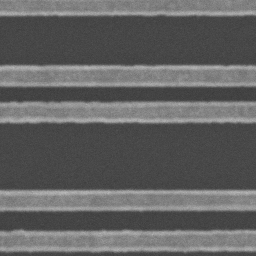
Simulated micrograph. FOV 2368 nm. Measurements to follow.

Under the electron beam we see lines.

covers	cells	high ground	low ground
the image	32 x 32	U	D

UUUUUUUUUUUUUUUUUUUUUUUUUUUUUUUU
UUUUUUUUUUUUUUUUUUUUUUUUUUUUUUUU
DDDDDDDDDDDDDDDDDDDDDDDDDDDDDDDD
DDDDDDDDDDDDDDDDDDDDDDDDDDDDDDDD
DDDDDDDDDDDDDDDDDDDDDDDDDDDDDDDD
DDDDDDDDDDDDDDDDDDDDDDDDDDDDDDDD
DDDDDDDDDDDDDDDDDDDDDDDDDDDDDDDD
DDDDDDDDDDDDDDDDDDDDDDDDDDDDDDDD
UUUUUDUUUUUUUUUUUUUUUUUUUUUUUUUU
UUUUUUUUUUUUUUUUUUUUUUUUUUUUUUUU
UUUUUUUUUUUUUUUUUUUUUUUUUUUUUUUU
DDDDDDDDDDDDDDDDDDDDDDDDDDDDDDDD
DDDDDDDDDDDDDDDDDDDDDDDDDDDDDDDD
UUUUUUUUUUUUUUUUUUUUUUUUUUUUUUUU
UUUUUUUUUUUUUUUUUUUUUUUUUUUUUUUU
DDDDDDDDDDDDDDDDDDDDDDDDDDDDDDDD
DDDDDDDDDDDDDDDDDDDDDDDDDDDDDDDD
DDDDDDDDDDDDDDDDDDDDDDDDDDDDDDDD
DDDDDDDDDDDDDDDDDDDDDDDDDDDDDDDD
DDDDDDDDDDDDDDDDDDDDDDDDDDDDDDDD
DDDDDDDDDDDDDDDDDDDDDDDDDDDDDDDD
DDDDDDDDDDDDDDDDDDDDDDDDDDDDDDDD
DDDDDDDDDDDDDDDDDDDDDDDDDDDDDDDD
DDDDDDDDDDDDDDDDDDDDDDDDDDDDDDDD
UUUUUUUUUUUUUUUUUUUUUUUUUUUUUUUU
UUUUUUUUUUUUUUUUUUUUUUUUUUUUUUUU
DDDDDDDDDDDDDDDDDDDDDDDDDDDDDDDD
DDDDDDDDDDDDDDDDDDDDDDDDDDDDDDDD
DDDDDDDDDDDDDDDDDDDDDDDDDDDDDDDD
UUUUUUUUUUUUUUUUUUUUUUUUUUUUUUUU
UUUUUUUUUUUUUUUUUUUUUUUUUUUUUUUU
DDDDDDDDDDDDDDDDDDDDDDDDDDDDDDDD